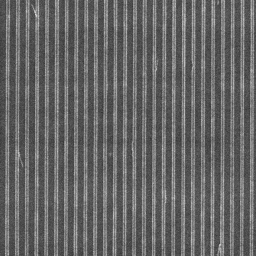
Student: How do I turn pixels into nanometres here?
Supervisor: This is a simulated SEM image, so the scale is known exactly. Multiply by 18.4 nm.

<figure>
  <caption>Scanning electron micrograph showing parallel lines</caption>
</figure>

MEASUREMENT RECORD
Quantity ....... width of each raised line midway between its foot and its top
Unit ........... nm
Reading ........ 55.2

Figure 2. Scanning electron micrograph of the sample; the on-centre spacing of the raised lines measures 180 nm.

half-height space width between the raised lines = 0.127 micrometres